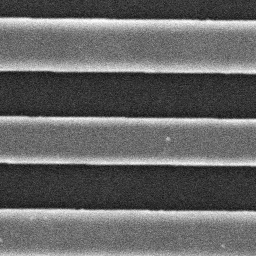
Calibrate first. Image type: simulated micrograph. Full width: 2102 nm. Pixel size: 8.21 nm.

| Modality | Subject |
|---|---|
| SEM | lines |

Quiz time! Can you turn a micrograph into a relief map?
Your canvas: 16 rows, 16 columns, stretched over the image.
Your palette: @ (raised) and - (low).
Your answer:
----------------
@@@@@@@@@@@@@@@@
@@@@@@@@@@@@@@@@
@@@@@@@@@@@@@@@@
---------@@@@@@@
----------------
----------------
@@@@@@@@@@@@@@@@
@@@@@@@@@@@@@@@@
@@@@@@@@@@@@@@@@
----------------
----------------
----------------
@@@@@@@@@@@@@@@@
@@@@@@@@@@@@@@@@
@@@@@@@@@@@@@@@@